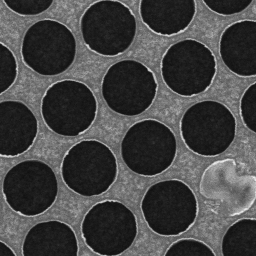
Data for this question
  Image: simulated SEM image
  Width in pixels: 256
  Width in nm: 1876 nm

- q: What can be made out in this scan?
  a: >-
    a regular array of holes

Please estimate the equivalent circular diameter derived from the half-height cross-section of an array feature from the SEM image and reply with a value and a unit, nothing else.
401 nm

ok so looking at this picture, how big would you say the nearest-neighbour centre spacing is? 0.461 micrometres